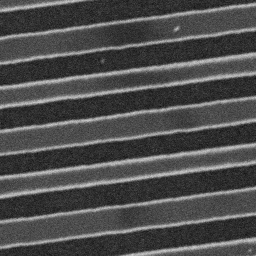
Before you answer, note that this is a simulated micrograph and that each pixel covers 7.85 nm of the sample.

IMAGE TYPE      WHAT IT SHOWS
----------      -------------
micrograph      lines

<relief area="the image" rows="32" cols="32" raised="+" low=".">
++++++++........................
........................++++++++
................++++++++++++++++
.........+++++++++++++++++++++++
.++++++++++++++++++++++++++.....
+++++++++++++++++++.............
++++++++++++....................
++++......................++++++
..................++++++++++++++
..........+++++++++++++++++++++.
...++++++++++++++++++++.........
+++++++++++++++.................
+++++++......................+++
.....................+++++++++++
..............++++++++++++++++++
......++++++++++++++++++++++++..
++++++++++++++++++++++..........
++++++++++++++++................
++++++++....................++++
....................++++++++++++
.............+++++++++++++++++++
.....+++++++++++++++++++........
+++++++++++++++++...............
+++++++++.......................
++......................++++++++
.................+++++++++++++++
.........+++++++++++++++++++++++
.++++++++++++++++++++++++++.....
+++++++++++++++++++.............
++++++++++++....................
+++++.....................++++++
...................+++++++++++++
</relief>